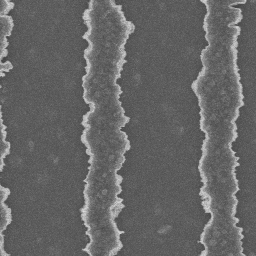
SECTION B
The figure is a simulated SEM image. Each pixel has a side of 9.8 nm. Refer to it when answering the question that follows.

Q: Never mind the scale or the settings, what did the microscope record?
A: one or a few lines or trenches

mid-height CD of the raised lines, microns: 0.338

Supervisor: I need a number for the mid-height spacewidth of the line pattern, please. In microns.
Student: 0.779